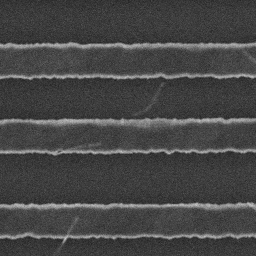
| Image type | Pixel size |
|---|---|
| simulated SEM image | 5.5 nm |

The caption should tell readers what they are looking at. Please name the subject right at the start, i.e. lines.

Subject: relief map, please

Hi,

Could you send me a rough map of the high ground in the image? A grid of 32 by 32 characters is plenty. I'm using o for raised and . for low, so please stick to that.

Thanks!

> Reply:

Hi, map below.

................................
................................
................................
................................
................................
...............................o
oooooooooooooooooooooooooooooooo
oooooooooooooooooooooooooooooooo
oooooooooooooooooooooooooooooooo
oooooooooooooooooooooooooooooooo
................................
................................
................................
................................
................................
oooooooooooooooooooooooooooooooo
oooooooooooooooooooooooooooooooo
oooooooooooooooooooooooooooooooo
oooooooooooooooooooooooooooooooo
................................
................................
................................
................................
................................
................................
........................o.....oo
oooooooooooooooooooooooooooooooo
oooooooooooooooooooooooooooooooo
oooooooooooooooooooooooooooooooo
oooooooooooooooooooooooooooooooo
................................
................................